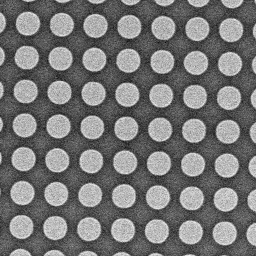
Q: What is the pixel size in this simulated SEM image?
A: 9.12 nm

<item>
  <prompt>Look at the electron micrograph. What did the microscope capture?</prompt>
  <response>an array of small figures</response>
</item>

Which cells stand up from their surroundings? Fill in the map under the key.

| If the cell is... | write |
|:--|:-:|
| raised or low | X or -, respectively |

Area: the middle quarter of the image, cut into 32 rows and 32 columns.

X----XXXXX----XXXXX---XXXXX---XX
------XXX-----XXXX-----XXXX----X
--------------------------------
--------------------------------
--------------------------------
X----XXXX-----XXXX-----XXX------
XX---XXXXX---XXXXX----XXXXX---XX
XX---XXXXX---XXXXXX--XXXXXX---XX
X----XXXXX---XXXXXX--XXXXXX---XX
X----XXXX-----XXXX----XXXXX---XX
-----------------------XX------X
--------------------------------
--------------------------------
X-----XXX-----XXX---------------
X----XXXXX---XXXXX----XXXX-----X
X---XXXXXX---XXXXX---XXXXXX---XX
X---XXXXXX---XXXXX---XXXXXX---XX
X----XXXX----XXXXX---XXXXXX---XX
------XX------XXX-----XXXX----XX
--------------------------------
--------------------------------
--------------------------------
X----XXXX----XXXX-----XXX------X
X---XXXXXX---XXXXX---XXXXX----XX
X---XXXXXX---XXXXX---XXXXXX---XX
X---XXXXX----XXXXX---XXXXX---XXX
-----XXXX----XXXXX---XXXXX----XX
-----------------------XX------X
--------------------------------
--------------------------------
-----XXX------XX----------------
X---XXXXX----XXXX----XXXXX----XX